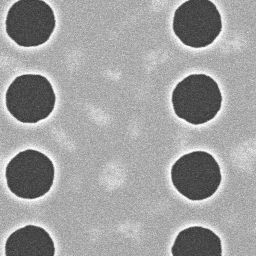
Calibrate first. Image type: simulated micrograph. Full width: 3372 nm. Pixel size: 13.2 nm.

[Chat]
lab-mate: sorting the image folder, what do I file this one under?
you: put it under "holes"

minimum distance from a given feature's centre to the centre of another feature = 1010 nm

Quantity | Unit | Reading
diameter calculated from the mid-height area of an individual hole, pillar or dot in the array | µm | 0.664